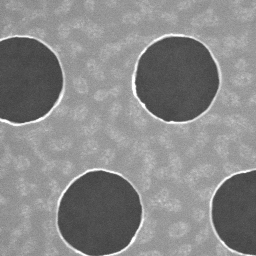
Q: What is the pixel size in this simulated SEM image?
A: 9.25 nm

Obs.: holes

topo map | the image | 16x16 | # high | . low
################
################
..########..####
...######....###
....####......##
....####......##
...######....###
..########..####
################
################
################
#####...######..
####.....####...
####.....####...
####.....#####..
#####...######..